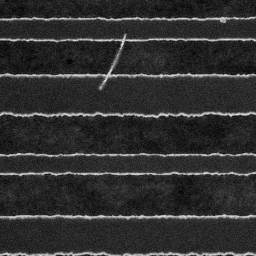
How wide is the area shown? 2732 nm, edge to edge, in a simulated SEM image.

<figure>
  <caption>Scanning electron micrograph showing lines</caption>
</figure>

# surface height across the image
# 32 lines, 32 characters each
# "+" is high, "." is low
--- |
................................
................................
++++++++++++++++++++++++++++++++
++++++++++++++++++++++++++++++++
++++++++++++++++++++++++++++++++
................................
................................
................................
................................
++++++++++++++++++++++++++++++++
++++++++++++++++++++++++++++++++
++++++++++++++++++++++++++++++++
++++++++++++++++++++++++++++++++
++++++++++++++++++++++++++++++++
..................++............
................................
................................
................................
................................
++++++++++++++++++++++++++++++++
++++++++++++++++++++++++++++++++
++++++++++++++++++++++++++++++++
................................
................................
................................
................................
................................
++++++++++++++++++++++++++++++++
++++++++++++++++++++++++++++++++
++++++++++++++++++++++++++++++++
++++++++++++++++++++++++++++++++
++++++++++++++++++++++++++++++++